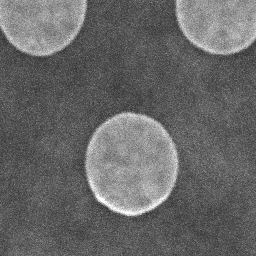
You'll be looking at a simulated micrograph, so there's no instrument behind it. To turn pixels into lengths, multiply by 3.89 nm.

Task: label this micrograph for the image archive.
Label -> raised bodies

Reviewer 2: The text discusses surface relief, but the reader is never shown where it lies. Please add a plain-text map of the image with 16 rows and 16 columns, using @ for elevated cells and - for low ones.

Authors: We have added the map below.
@@@@@------@@@@@
@@@@@------@@@@@
-@@@--------@@@@
----------------
----------------
----------------
----------------
-------@@@------
------@@@@@-----
-----@@@@@@-----
-----@@@@@@-----
------@@@@@-----
------@@@@------
----------------
----------------
----------------